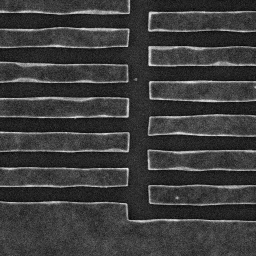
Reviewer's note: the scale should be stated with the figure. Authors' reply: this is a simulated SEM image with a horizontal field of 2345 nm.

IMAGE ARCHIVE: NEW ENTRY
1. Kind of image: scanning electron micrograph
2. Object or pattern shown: groups of lines, slits or small figures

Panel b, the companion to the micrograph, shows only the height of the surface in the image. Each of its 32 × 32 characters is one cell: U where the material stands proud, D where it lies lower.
UUUUUUUUUUUUUUUUDDDDDDDDDDDDDDDD
UUUUUUUUUUUUUUUUDDDDDDDDDDDDDDUU
DDDDDDDDDDDDDDDDDDDUUUUUUUUUUUUU
DDDDDDUUUUDDDDDDDDDUUUUUUUUUUUUU
UUUUUUUUUUUUUUUUDDDDDDDDDDDDDDDD
UUUUUUUUUUUUUUUUDDDDDDDDDDDDDDDD
DDDDDDDDDDDDDDDDDDDUUUUUUUUUUUUU
DDDDDDDDDDDDDDDDDDDUUUUUUUUUUUUU
UUUUUUUUUUUUUUUUDDDDDDDDDDDDDDDD
UUUUUUUUUUUUUUUUDDDDDDDDDDDDDDDD
DDDDDDDDDDDDDDDDDDDUUUUUUUUUUUUU
DDDDDDDDDDDDDDDDDDDUUUUUUUUUUUUU
UUUUUUUUUUUUUUUUDDDDDDDUUUUUUUUU
UUUUUUUUUUUUUUUUDDDDDDDDDDDDDDDD
UUUUUUUUUUUUUUUUDDDDDDDDUUUUUUUU
DDDDDDDDDDDDDDDDDDDUUUUUUUUUUUUU
DDDDDDDDDDDDDDDDDDDUUUUUUUUUUUUU
UUUUUUUUUUUUUUUUDDDDDDDDDDDDDDDD
UUUUUUUUUUUUUUUUDDDDDDDDDDDDDDDD
DDDDDDDDDDDDDDDDDDUUUUUUUUUUUUUU
DDDDDDDDDDDDDDDDDDDUUUUUUUUUUUUU
UUUUUUUUUUUUUUUUDDDDDDDDDDDDDDDD
UUUUUUUUUUUUUUUUDDDDDDDDDDDDDDDD
DDDDDDDDDDDDDDDDDDDUUUUUUUUUUUUU
DDDDDDDDDDDDDDDDDDDUUUUUUUUUUUUU
UUUUUUUUUUUUUUUDDDDUUUUUUUUUDDDD
UUUUUUUUUUUUUUUUDDDDDDDDDDDDDDDD
UUUUUUUUUUUUUUUUDDDDDDDDDDDDDDDD
UUUUUUUUUUUUUUUUUUUUUUUUUUUUUUUU
UUUUUUUUUUUUUUUUUUUUUUUUUUUUUUUU
UUUUUUUUUUUUUUUUUUUUUUUUUUUUUUUU
UUUUUUUUUUUUUUUUUUUUUUUUUUUUUUUU